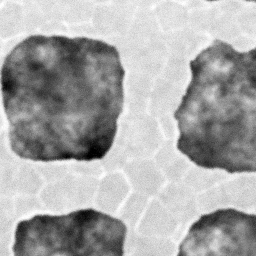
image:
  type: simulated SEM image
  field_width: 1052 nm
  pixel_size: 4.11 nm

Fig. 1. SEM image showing holes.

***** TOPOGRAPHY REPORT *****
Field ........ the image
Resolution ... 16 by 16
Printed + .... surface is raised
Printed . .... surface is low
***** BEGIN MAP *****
++++++++++++++++
++++++++++++++++
+.....++++++++++
.......+++++....
........++++....
........++++....
........+++.....
.......++++.....
+......++++.....
+......++++.....
+++++++++++++...
++++++++++++++++
++++++++++++++++
++.....++++++...
+.......++++....
+.......+++.....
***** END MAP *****